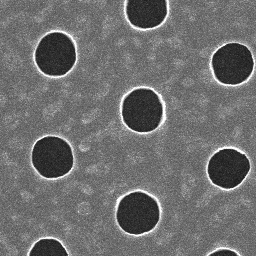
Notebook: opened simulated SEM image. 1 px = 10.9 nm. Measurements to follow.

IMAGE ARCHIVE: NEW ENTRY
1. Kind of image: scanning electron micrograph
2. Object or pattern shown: holes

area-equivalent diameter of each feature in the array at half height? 463 nm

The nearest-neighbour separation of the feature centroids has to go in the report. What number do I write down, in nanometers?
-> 1100